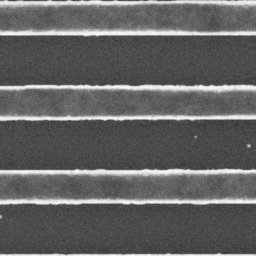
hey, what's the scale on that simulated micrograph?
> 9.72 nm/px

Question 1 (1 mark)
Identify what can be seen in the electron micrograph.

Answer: lines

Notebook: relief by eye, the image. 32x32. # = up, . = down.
################################
################################
################################
################################
................................
................................
................................
................................
................................
................................
................................
################################
################################
################################
################################
................................
................................
................................
................................
................................
................................
################################
################################
################################
################################
................................
................................
................................
................................
................................
................................
................................